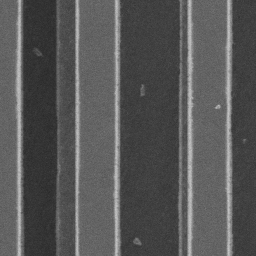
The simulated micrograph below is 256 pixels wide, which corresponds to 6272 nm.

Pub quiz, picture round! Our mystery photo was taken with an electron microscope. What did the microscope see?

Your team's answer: lines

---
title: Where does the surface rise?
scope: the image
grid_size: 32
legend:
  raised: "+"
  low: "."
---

+++....++++++++........++++++...
+++....++++++++........++++++...
+++....++++++++........++++++...
+++....++++++++........++++++...
+++....++++++++........++++++...
+++....++++++++........++++++...
+++....++++++++........++++++...
+++....++++++++........++++++...
+++....++++++++........++++++...
+++....++++++++........++++++...
+++....++++++++........++++++...
+++....++++++++........++++++...
+++....++++++++........++++++...
+++....++++++++........++++++...
+++....++++++++........++++++...
+++....++++++++........++++++...
+++....++++++++........++++++...
+++....++++++++........++++++...
+++....++++++++........++++++...
+++....++++++++........++++++...
+++....++++++++........++++++...
+++....++++++++........++++++...
+++....++++++++........++++++...
+++....++++++++........++++++...
+++....++++++++........++++++...
+++....++++++++........++++++...
+++....++++++++........++++++...
+++....++++++++........++++++...
+++....++++++++........++++++...
+++....++++++++........++++++...
+++....++++++++........++++++...
+++....++++++++........++++++...